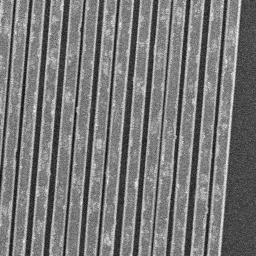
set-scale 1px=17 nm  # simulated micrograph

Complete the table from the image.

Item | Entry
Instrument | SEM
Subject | parallel lines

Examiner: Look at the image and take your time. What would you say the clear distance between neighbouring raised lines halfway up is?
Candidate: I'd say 0.114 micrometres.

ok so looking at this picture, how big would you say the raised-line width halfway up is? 197 nanometres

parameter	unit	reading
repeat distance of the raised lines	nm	299